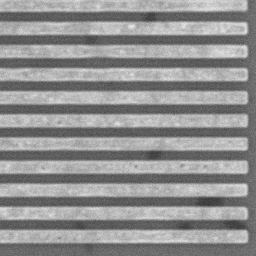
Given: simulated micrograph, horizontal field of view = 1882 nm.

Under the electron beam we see groups of lines, slits or small figures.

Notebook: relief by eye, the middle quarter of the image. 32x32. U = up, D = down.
DDDDDDDDDDDDDDDDDDDDDDDDDDDDDDDD
UUUUUDDDDDDUUUUUUUUUUUUUDDUUUUUU
UUUUUUUUUUUUUUUUUUUUUUUUUDUUDUUU
UUUUUUUUUUUUUUUUUUUUUUUUUUUUUUUU
DDDDDDDDDDDDDDDDDDDDDDDDDDDDDDDD
DDDDDDDDDDDDDDDDDDDDDDDDDDDDDDDD
DDDDDDDDDDDDDDDDDDDDDDDDDDDDDDDD
UUUUUUUUUUUUUUUUUUUUUUUUUUUUUUUU
UUUUUUUUUUUUDUUDUUUUUUUUUUUUUUUU
DUUUUUUUUUUUUUUUUUUUUUUUUUUUUUUU
DDDDDDDDDDDDDDDDDDDDDDDDDDDDDDDD
DDDDDDDDDDDDDDDDDDDDDDDDDDDDDDDD
DDDDDDDDDDDDDDDDDDDDDDDDDDDDDDDD
UUUUUUUUUUUUUUUUUUUUUUUUUUUUUUUU
UUUUUUUUUUUUUUUUUUUUUUUUUUUUUUUU
DUUUUUUUUUUUUUUUUDDDDDDDUUUUUUUU
DDDDDDDDDDDDDDDDDDDDDDDDDDDDDDDD
DDDDDDDDDDDDDDDDDDDDDDDDDDDDDDDD
DDDDDDDDDDDDDDDDDDDDDDDDDDDDDDDD
UUUUUUUUUUUUUUUUUUUUUUUUUUUUUUUU
UUUUUUUUUUUUUUUUUUUUUUUUUUUUUUUU
DDDDDDDDDDDDDDDDDDDDDDDDDDDDDDDD
DDDDDDDDDDDDDDDDDDDDDDDDDDDDDDDD
DDDDDDDDDDDDDDDDDDDDDDDDDDDDDDDD
DDDDDDDDDDDDDDUUUUDDDDDUUUUUUUUD
UUUUUUUUUUUUUUUUUDUUUUUUUUUUUDDU
UUUUUUUUUUUUUUUUUUUUUUUUUUUUUUUU
DDDDDDDDDDDDDDDDDDDDDDDDDDDDDDDD
DDDDDDDDDDDDDDDDDDDDDDDDDDDDDDDD
DDDDDDDDDDDDDDDDDDDDDDDDDDDDDDDD
UUUUUUUUUUUUUUUUUUUUUUUUUUUUUUUU
UUUUUUUUUUUUUUUUUUUUUUUUUUUUUUUU